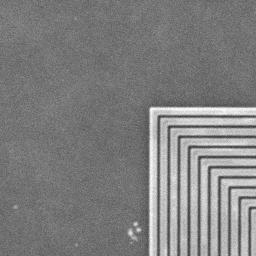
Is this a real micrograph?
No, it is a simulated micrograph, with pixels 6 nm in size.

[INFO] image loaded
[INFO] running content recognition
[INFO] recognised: groups of lines, slits or small figures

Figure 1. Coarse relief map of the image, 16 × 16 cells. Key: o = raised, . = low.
................
................
................
................
................
................
................
..........oooooo
..........oooooo
..........ooo...
..........oooooo
..........oooooo
..........oooooo
..........oooooo
..........oooooo
..........oooooo